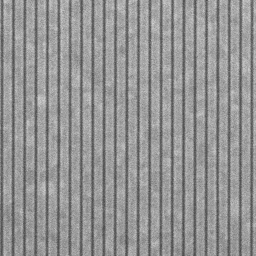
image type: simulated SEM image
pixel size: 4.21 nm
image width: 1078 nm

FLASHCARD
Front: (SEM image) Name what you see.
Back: parallel lines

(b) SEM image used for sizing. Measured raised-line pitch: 0.0479 um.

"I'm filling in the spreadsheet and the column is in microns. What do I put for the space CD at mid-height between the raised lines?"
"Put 0.0147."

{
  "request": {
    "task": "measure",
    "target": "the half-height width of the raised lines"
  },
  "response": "32.6 nanometers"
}